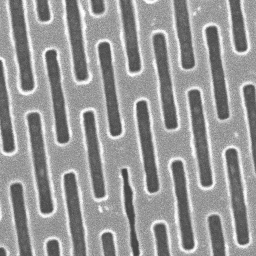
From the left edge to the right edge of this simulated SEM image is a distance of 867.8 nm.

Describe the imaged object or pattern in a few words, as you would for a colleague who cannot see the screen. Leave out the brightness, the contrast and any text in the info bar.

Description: a regular array of holes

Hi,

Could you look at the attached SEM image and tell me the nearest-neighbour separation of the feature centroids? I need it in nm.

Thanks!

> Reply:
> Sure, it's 182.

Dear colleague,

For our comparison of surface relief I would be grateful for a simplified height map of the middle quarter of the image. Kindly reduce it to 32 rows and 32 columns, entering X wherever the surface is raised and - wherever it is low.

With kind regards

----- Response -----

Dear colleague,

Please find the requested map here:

XX----XXX---XXXX---XXXX---XXX---
XXX---XXX---XXXX---XXXX---XXXXXX
XXX---XXX----XXXXXXXXXXX---XXXXX
XXX---XXXX---XXXXXXXXXXX---XXXXX
XXXXXXXXXX---XXXXXXXXXXX---XXXXX
XXXXXXXXXX---XXXXXXXXXXX---XXXXX
XXXXXXXXXX---XXXXXXXXXXX---XXXXX
XXXXXXXXXX---XXXXXXXXXXX---XXXX-
XXXXXXXXXX---XXXXXXXXXXX----XXX-
XXXXXXXXXX---XXXXXX--XXX----XXX-
XXXXXXXXXXX---XXXX---XXXX---XXX-
XXXXXXXXXXX---XXXX---XXXX---XXXX
-XXXX---XXX---XXXX---XXXX---XXXX
-XXXX---XXX---XXXX----XXX---XXXX
-XXXX---XXX---XXXX---XXXX---XXXX
-XXXX---XXX----XXX----XXX----XXX
-XXXX---XXX----XXXX---XXXXXXXXXX
-XXXX---XXXX--XXXXX---XXXXXXXXXX
-XXXX---XXXXXXXXXXX---XXXXXXXXXX
-XXXXX---XXXXXXXXXX---XXXXXXXXXX
XXXXXX---XXXXXXXXXX---XXXXXXXXXX
XXXXXX---XXXXXXXXXX----XXXXXXXXX
XXXXXX---XXXXXXXXXXX---XXXXXXXXX
XXXXXX---XXXXXXXXXXX---XXXXXXXXX
XXXXXX---XXXXXXXXXXX---XXXX--XXX
XXXXXX---XXXXXXXXXXX---XXXX---XX
XXXXXX----XXXX--XXXX---XXXX---XX
X-XXXXX---XXXX--XXXX---XXXX---XX
---XXXX---XXXXX-XXXXX---XXX---XX
---XXXX---XXXXX-XXXXX---XXX---XX
---XXXX---XXXXX-XXXXX---XXXX---X
----XXX---XXXXX--XXXX---XXXX---X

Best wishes